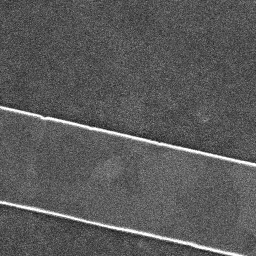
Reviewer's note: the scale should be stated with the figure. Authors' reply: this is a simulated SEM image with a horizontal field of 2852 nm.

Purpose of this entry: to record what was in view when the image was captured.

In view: one or a few lines or trenches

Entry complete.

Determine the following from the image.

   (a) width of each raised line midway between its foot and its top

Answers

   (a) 1030 nm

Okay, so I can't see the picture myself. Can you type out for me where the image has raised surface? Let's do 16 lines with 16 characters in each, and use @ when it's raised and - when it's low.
----------------
----------------
----------------
----------------
----------------
----------------
----------------
@@@-------------
@@@@@@@@--------
@@@@@@@@@@@@----
@@@@@@@@@@@@@@@@
@@@@@@@@@@@@@@@@
@@@@@@@@@@@@@@@@
----@@@@@@@@@@@@
--------@@@@@@@@
-------------@@@